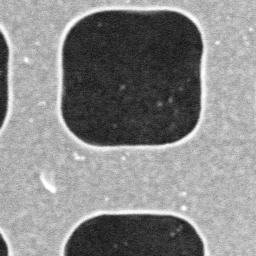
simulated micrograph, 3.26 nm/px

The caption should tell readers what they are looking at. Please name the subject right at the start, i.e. holes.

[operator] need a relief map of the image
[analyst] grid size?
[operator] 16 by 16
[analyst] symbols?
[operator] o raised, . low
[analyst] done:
oooooooooooooooo
ooooo.......oooo
oooo.........ooo
.ooo.........ooo
.ooo.........ooo
.ooo.........ooo
.ooo.........ooo
oooo........oooo
ooooo.......oooo
oooooooooooooooo
oooooooooooooooo
oooooooooooooooo
oooooooooooooooo
oooooo.....ooooo
ooooo.......oooo
oooo.........ooo